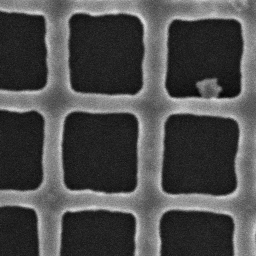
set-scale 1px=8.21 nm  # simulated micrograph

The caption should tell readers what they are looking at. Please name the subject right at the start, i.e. holes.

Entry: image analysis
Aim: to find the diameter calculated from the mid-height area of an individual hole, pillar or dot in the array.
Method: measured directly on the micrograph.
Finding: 0.715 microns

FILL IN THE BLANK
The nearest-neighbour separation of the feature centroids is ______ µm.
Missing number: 0.807